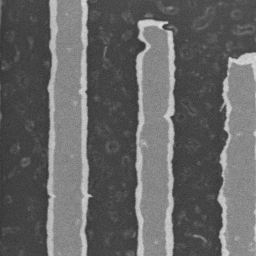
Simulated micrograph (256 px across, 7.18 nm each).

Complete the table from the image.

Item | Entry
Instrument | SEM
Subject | one or a few lines or trenches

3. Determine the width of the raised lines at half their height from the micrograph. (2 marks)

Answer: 0.226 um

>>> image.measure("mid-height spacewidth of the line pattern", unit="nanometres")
396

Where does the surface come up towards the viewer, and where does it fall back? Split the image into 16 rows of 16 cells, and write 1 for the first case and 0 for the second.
0001100000000000
0001100001000000
0001100001100000
0001100001100000
0001100001100011
0001100001100011
0001100001100011
0001100001100011
0001100001100011
0001100001100011
0001100001100011
0001100001100011
0001100001100011
0001100001100011
0001100001100011
0001100001100011